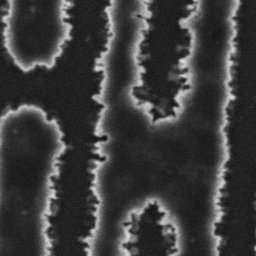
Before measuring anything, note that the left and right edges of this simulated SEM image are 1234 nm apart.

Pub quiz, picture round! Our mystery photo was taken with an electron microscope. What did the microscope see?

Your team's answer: one or a few lines or trenches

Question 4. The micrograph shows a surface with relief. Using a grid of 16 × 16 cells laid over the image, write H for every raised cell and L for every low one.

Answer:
LHHHLLLHHLLLHHHL
HHHHLLLHHLLHHHHL
HHHHLLLHHLLLHHHL
LHHHLLHHHLLLHHLL
LLLLLLHHHLLLHHLL
LLLLLLHHHLLLHHLL
LLLLLLHHHLLHHHLL
HHHLLLHHHHHHHHLL
HHHHLLHHHHHHHHLL
HHHHLLHHHHHHHHLL
HHHHLLHHHHHHHHLL
HHHLLLHHHHHHHHLL
HHHLLLHHHHHHHHLL
HHHLLLHHLLHHHHLL
HHHLLLHHLLLHHLLL
HHHLLHHHLLLHHHLL